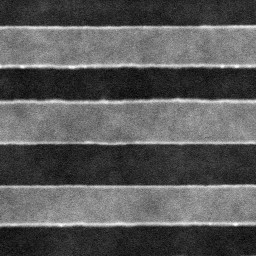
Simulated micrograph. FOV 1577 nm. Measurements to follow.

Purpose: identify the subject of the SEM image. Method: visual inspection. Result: lines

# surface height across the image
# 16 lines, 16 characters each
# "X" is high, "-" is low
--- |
----------------
----------------
XXXXXXXXXXXXXXXX
XXXXXXXXXXXXXXXX
----------------
----------------
XXXXXXXXXXXXXXXX
XXXXXXXXXXXXXXXX
XXXXXXXXXXXXXXXX
----------------
----------------
----------------
XXXXXXXXXXXXXXXX
XXXXXXXXXXXXXXXX
----------------
----------------